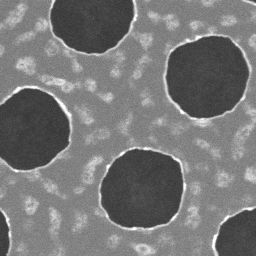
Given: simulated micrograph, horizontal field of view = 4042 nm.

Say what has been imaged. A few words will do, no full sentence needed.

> holes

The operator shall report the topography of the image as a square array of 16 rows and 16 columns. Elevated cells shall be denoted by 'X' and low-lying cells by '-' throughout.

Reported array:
XXX-----XXXXXXXX
XXX-----XXXXXXXX
XXXX----XXXX--XX
XXXXXXXXXXX----X
XXXXXXXXXX------
XXXXXXXXXX-----X
----XXXXXXX----X
----XXXXXXXXXXXX
----XXXXXXXXXXXX
----XXXX--XXXXXX
X-XXXXX----XXXXX
XXXXXX-----XXXXX
XXXXXX-----XXXXX
XXXXXXX----XXXX-
-XXXXXXXXXXXXX--
-XXXXXXXXXXXX---